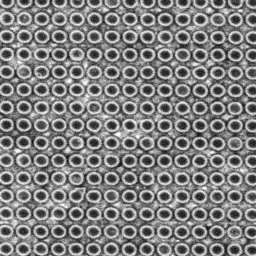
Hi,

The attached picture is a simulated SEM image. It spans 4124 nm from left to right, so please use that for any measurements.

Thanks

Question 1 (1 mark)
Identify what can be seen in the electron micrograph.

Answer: a regular array of raised bodies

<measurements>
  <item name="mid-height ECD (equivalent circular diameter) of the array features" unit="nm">202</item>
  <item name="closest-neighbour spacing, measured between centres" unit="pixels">17.4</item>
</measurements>